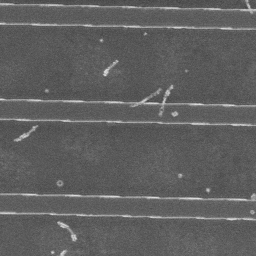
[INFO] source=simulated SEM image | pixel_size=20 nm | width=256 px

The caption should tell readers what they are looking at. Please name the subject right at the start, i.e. lines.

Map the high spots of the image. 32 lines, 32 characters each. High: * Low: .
*...............................
********************************
********************************
...........................*****
................................
................................
................................
................................
................................
................................
................................
................................
*...............................
********************************
********************************
.......................*********
................................
................................
................................
................................
................................
................................
................................
................................
**********......................
********************************
********************************
................................
................................
................................
................................
................................